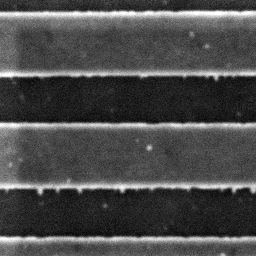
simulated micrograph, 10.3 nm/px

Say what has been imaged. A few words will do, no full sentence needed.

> lines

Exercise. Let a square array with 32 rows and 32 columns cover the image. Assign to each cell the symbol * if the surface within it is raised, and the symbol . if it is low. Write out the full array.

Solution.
................................
................................
********************************
********************************
********************************
********************************
********************************
********************************
********************************
................................
................................
................................
................................
................................
................................
*******************.************
********************************
********************************
********************************
********************************
********************************
********************************
********************************
................................
................................
................................
................................
................................
................................
................................
********************************
********************************